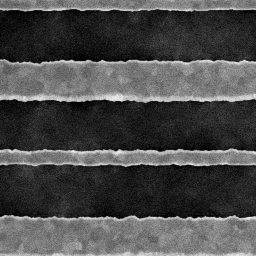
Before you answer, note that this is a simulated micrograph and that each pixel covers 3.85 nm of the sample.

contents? lines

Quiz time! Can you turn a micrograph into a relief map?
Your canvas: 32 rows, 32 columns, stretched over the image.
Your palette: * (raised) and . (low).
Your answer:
********************************
................................
................................
................................
................................
................................
................................
................................
********************************
********************************
********************************
********************************
...*...****......******.***.**..
................................
................................
................................
................................
................................
................................
********************************
*..**.**.***********************
................................
................................
................................
................................
................................
................................
********************************
********************************
********************************
********************************
********************************